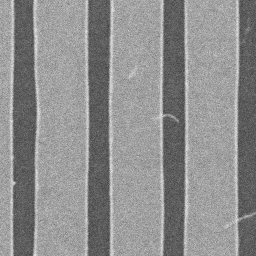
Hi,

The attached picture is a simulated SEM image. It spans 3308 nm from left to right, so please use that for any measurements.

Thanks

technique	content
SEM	one or a few lines or trenches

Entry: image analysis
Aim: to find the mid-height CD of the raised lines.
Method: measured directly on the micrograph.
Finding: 0.662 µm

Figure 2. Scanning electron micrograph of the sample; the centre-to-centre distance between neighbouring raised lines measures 0.969 microns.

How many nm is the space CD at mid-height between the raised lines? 307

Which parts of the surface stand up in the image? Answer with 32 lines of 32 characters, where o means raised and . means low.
oo..ooooooo...oooooo...ooooooo..
oo..ooooooo...oooooo...ooooooo..
oo..ooooooo...oooooo...ooooooo..
oo..ooooooo...oooooo...ooooooo..
oo..ooooooo...oooooo...ooooooo..
oo..ooooooo...oooooo...ooooooo..
oo..ooooooo...oooooo...ooooooo..
oo..ooooooo...oooooo...ooooooo..
o...ooooooo...oooooo...ooooooo..
o...ooooooo...oooooo...ooooooo..
o....oooooo...oooooo...ooooooo..
o....oooooo...oooooo...ooooooo..
o....oooooo...oooooo...oooooo...
o....oooooo...oooooo...oooooo...
o....oooooo...oooooo...oooooo...
o....oooooo...oooooo...oooooo...
o....oooooo...oooooo...oooooo...
o....oooooo...oooooo...oooooo...
o....oooooo...oooooo...oooooo...
o....oooooo...oooooo...oooooo...
o....oooooo...oooooo...oooooo...
o....oooooo...oooooo...oooooo...
oo...oooooo...oooooo...ooooooo..
oo...oooooo...oooooo...ooooooo..
o....oooooo...oooooo...ooooooo..
o...ooooooo...oooooo...ooooooo..
o...ooooooo...oooooo...ooooooo..
o....oooooo...oooooo...ooooooo..
o...ooooooo...oooooo...ooooooo..
o...ooooooo...oooooo...ooooooo..
o...ooooooo...oooooo...ooooooo..
o...ooooooo...oooooo...ooooooo..